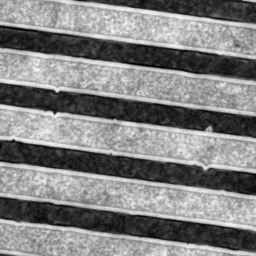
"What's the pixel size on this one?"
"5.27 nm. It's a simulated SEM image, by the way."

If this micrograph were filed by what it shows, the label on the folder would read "parallel lines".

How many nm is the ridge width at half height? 164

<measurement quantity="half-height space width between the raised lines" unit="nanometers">134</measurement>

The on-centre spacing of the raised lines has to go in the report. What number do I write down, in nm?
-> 298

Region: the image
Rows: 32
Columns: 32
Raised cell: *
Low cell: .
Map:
***********.....................
*******************.............
**************************......
....****************************
...........*********************
...................*************
***........................*****
**********......................
******************..............
*************************.......
....****************************
...........*********************
...................*************
**.......................*******
*********.......................
*****************...............
*************************.......
...*****************************
.........***********************
.................***************
*........................*******
*********.......................
****************................
************************........
.*****************************..
.........***********************
................****************
.......................*********
********.......................*
***************.................
***********************.........
.****************************...